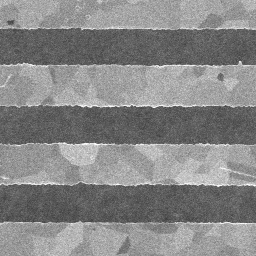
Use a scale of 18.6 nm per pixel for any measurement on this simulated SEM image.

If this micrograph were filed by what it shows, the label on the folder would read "one or a few lines or trenches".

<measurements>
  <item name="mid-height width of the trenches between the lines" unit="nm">702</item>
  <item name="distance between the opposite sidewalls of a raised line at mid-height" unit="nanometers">757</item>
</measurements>